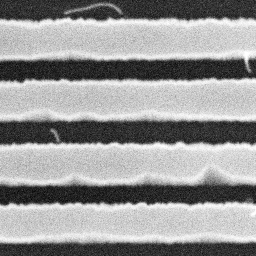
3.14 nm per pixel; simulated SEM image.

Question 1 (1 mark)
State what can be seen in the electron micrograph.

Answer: lines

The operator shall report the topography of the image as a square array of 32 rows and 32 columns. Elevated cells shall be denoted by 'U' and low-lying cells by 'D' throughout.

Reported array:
DDDDDDDDDDDDDDDDDDDDDDDDDDDDDDDD
DDDDDDDDDDDDDDDDDDDDDDDDDDDDDDDD
DDDDDDDDUDDDDDDDDDDDDDDDDDUDDDUD
UUUUUUUUUUUUUUUUUUUUUUUUUUUUUUUU
UUUUUUUUUUUUUUUUUUUUUUUUUUUUUUUU
UUUUUUUUUUUUUUUUUUUUUUUUUUUUUUUU
UUUUUUUUUUUUUUUUUUUUUUUUUUUUUUUU
DDDDDDDDDDDDDDDDDDDDDDDDDDDDDDDD
DDDDDDDDDDDDDDDDDDDDDDDDDDDDDDDD
DDDDDDDDDDDDDDDDDDDDDDDDDDDDDDDD
UUUUUUUUUUUUUUUUUUUUUUUUUUUUUUUU
UUUUUUUUUUUUUUUUUUUUUUUUUUUUUUUU
UUUUUUUUUUUUUUUUUUUUUUUUUUUUUUUU
UUUUUUUUUUUUUUUUUUUUUUUUUUUUUUUU
UUUUUUUUUUUUUUUUUUUUUUUUUUUUUUUU
DDDDDDDDDDDDDDDDDDDDDDDDDDDDDDDD
DDDDDDDDDDDDDDDDDDDDDDDDDDDDDDDD
DDDDDDDDDDDDDDDDDDDDDDDDDDDDDDDD
UUUUUUUUUUUUUUUUUUUUUUUUUUUUUUUU
UUUUUUUUUUUUUUUUUUUUUUUUUUUUUUUU
UUUUUUUUUUUUUUUUUUUUUUUUUUUUUUUU
UUUUUUUUUUUUUUUUUUUUUUUUUUUUUUUU
UUUUUUUUUUUUUUUUUUUUUUUUUDDDUUUU
DDDDDDDDDDDDDDDDDDDDDDDDDDDDDDDD
DDDDDDDDDDDDDDDDDDDDDDDDDDDDDDDD
DDDDDDDDDUDUDDDDDUDDUUUDDUUDUUUD
UUUUUUUUUUUUUUUUUUUUUUUUUUUUUUUU
UUUUUUUUUUUUUUUUUUUUUUUUUUUUUUUU
UUUUUUUUUUUUUUUUUUUUUUUUUUUUUUUU
UUUUUUUUUUUUUUUUUUUUUUUUUUUUUUUU
DDDDDDDDDDDDDDDDDDDDDDDDDDDDDDDD
DDDDDDDDDDDDDDDDDDDDDDDDDDDDDDDD